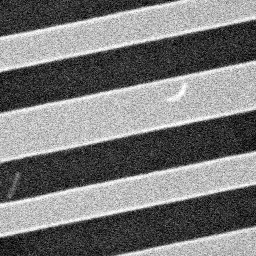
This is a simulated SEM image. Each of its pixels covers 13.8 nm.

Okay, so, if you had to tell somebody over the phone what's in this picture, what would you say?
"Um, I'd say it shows lines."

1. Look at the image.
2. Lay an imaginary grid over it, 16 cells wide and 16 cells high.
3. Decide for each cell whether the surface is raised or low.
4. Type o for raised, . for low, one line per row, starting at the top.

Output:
.........ooooooo
....oooooooooo..
oooooooooo......
ooooo...........
.............ooo
........oooooooo
...ooooooooooooo
ooooooooooooo...
oooooooo........
ooo.............
...........ooooo
......oooooooooo
..ooooooooo.....
oooooo..........
o.............oo
..........oooooo